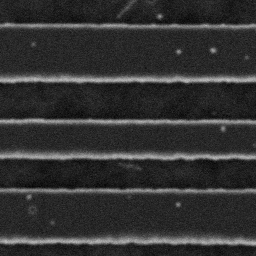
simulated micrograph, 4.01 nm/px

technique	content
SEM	lines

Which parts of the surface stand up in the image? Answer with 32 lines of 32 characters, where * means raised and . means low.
................................
................................
................................
********************************
********************************
********************************
********************************
********************************
********************************
********************************
................................
................................
................................
................................
................................
********************************
********************************
********************************
********************************
********************************
................................
................................
................................
................................
********************************
********************************
********************************
********************************
********************************
********************************
................................
................................